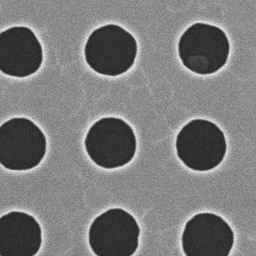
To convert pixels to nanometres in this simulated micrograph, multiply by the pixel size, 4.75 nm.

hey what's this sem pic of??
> holes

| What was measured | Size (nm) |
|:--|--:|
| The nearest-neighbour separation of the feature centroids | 434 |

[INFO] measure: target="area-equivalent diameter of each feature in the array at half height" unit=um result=0.243